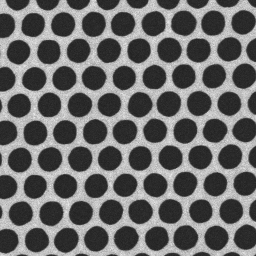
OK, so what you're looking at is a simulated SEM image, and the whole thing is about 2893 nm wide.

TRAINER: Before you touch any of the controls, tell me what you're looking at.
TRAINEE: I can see a regular array of holes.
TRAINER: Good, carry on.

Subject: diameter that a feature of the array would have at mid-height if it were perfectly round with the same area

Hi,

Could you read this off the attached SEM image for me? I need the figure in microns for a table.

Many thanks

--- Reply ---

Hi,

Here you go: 0.272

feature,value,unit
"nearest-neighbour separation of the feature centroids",0.337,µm